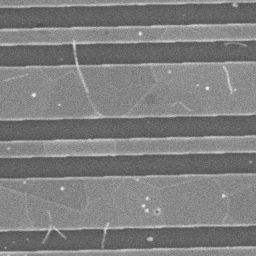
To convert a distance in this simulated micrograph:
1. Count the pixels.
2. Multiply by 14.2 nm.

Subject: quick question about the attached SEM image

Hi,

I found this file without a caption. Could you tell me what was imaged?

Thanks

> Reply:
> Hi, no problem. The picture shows lines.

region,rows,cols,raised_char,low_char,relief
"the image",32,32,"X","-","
XXXXXXXXXXXXXXXXXXX-------------
--------------------------------
--------------------------------
---------XXXXXXXXXXXXXXXXXXXXXXX
XXXXXXXXXXXXXXXXXXXXXXXXXXXXXXXX
XXXXXXXX-X----------------------
--------------------------------
--------------------------------
XXXXXXXXXXXXXXXXXXXXXXXXXXXXXXXX
XXXXXXXXXXXXXXXXXXXXXXXXXXXXXXXX
XXXXXXXXXXXXXXXXXXXXXXXXXXXXXXXX
XXXXXXXXXXXXXXXXXXXXXXXXXXXXXXXX
XXXXXXXXXXXXXXXXXXXXXXXXXXXXXXXX
XXXXXXXXXXXXXXXXXXXXXXXXXXXXXXXX
XXXXXXXXXXXXXXXXXXXXXX----------
--------------------------------
--------------------------------
-----------XXXXXXXXXXXXXXXXXXXXX
XXXXXXXXXXXXXXXXXXXXXXXXXXXXXXXX
XXXXXXXX------------------------
--------------------------------
--------------------------------
XXXXXXXXXXXXXXXXXXXXXXXXXXXXXXXX
XXXXXXXXXXXXXXXXXXXXXXXXXXXXXXXX
XXXXXXXXXXXXXXXXXXXXXXXXXXXXXXXX
XXXXXXXXXXXXXXXXXXXXXXXXXXXXXXXX
XXXXXXXXXXXXXXXXXXXXXXXXXXXXXXXX
XXXXXXXXXXXXXXXXXXXXXXXXXXXXXXXX
XXXXXXXXXXXXXXXX----------------
--------------------------------
--------------------------------
----XXXXXXXXXXXXXXXXXXXXXXXXXXXX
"